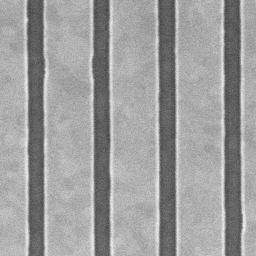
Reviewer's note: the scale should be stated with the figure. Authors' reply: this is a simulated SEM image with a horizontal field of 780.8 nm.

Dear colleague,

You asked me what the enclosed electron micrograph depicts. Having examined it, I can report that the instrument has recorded one or a few lines or trenches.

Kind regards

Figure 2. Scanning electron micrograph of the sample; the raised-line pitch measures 0.2 µm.